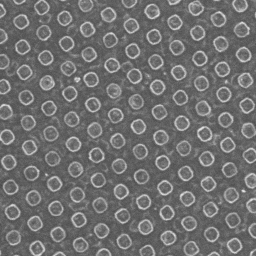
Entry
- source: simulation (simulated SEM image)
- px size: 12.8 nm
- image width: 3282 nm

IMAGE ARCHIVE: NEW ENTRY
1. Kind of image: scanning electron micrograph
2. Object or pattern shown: a regular array of raised bodies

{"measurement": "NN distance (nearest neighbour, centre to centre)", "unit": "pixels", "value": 25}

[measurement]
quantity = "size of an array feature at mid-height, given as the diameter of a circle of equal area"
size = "184 nm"